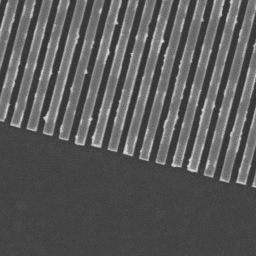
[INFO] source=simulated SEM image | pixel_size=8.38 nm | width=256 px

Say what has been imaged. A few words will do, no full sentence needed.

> parallel lines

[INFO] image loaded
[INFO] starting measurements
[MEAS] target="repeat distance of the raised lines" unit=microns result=0.139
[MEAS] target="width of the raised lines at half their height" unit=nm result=81.1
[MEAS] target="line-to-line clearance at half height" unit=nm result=56.7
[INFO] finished